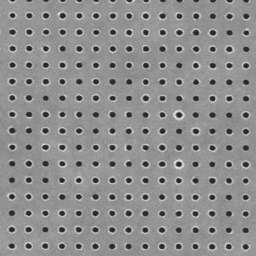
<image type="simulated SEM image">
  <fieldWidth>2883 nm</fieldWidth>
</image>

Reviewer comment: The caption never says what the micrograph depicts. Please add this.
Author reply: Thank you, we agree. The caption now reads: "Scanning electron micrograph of a regular array of holes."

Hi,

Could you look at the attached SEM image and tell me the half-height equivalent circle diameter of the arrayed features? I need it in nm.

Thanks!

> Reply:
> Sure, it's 67.2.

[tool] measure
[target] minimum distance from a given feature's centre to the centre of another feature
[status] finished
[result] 16.3 px